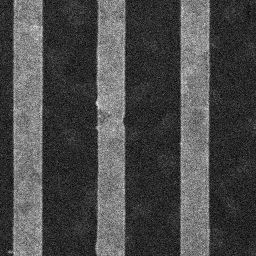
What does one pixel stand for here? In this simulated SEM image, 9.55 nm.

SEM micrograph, one or a few lines or trenches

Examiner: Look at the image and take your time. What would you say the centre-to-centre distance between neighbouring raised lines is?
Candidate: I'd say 798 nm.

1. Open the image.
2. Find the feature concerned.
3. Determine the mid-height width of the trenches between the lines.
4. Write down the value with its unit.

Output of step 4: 552 nanometers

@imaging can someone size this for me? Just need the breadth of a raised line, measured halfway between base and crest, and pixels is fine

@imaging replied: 26.4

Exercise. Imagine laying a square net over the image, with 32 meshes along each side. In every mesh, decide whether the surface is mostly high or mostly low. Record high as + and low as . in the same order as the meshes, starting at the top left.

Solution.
..+++.......+++........+++......
..+++.......+++........+++......
..+++.......+++........+++......
..+++.......+++........+++......
..+++.......+++........+++......
..+++.......+++........+++......
..+++.......+++........+++......
..+++.......+++........+++......
..+++.......+++........+++......
..+++.......+++........+++......
..+++.......+++........+++......
..+++.......+++........+++......
..+++.......+++........+++......
..+++.......+++........+++......
..+++.......+++........+++......
..+++.......+++........+++......
..+++.......+++........+++......
..+++.......+++........+++......
..+++.......+++........+++......
..+++.......+++........+++......
..+++.......+++........+++......
..+++.......+++........+++......
..+++.......+++........+++......
..+++.......+++........+++......
..+++.......+++........+++......
..+++.......+++........+++......
..+++.......++++.......+++......
..+++.......++++.......+++......
..+++.......+++........+++......
..+++.......+++........+++......
..+++.......+++........+++......
..+++.......+++........+++......